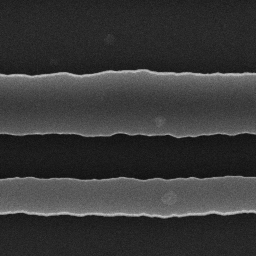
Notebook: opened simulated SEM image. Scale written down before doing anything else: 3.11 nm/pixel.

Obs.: lines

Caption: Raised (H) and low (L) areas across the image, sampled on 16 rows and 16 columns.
LLLLLLLLLLLLLLLL
LLLLLLLLLLLLLLLL
LLLLLLLLLLLLLLLL
LLLLLLLLLLLLLLLL
LLLLLLLHHHLLLLLL
HHHHHHHHHHHHHHHH
HHHHHHHHHHHHHHHH
HHHHHHHHHHHHHHHH
LLLLLLLLLLLHLLLL
LLLLLLLLLLLLLLLL
LLLLLLLLLLLLLLLL
HHHHHHHHHHHHHHHH
HHHHHHHHHHHHHHHH
LLLLLLLLLHHHLLLL
LLLLLLLLLLLLLLLL
LLLLLLLLLLLLLLLL